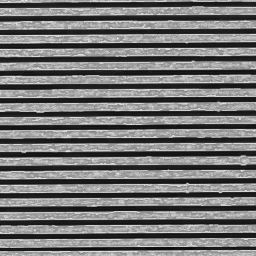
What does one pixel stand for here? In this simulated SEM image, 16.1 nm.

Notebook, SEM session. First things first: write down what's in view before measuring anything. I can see parallel lines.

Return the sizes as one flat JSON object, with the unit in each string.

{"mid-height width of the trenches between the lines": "74.3 nm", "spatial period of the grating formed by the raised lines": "219 nm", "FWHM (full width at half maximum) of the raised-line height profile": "148 nm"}